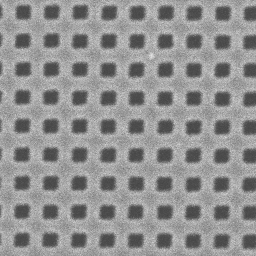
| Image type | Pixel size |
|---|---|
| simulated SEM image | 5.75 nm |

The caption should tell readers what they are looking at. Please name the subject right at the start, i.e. a regular array of holes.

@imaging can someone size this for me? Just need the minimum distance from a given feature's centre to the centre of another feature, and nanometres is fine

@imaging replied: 161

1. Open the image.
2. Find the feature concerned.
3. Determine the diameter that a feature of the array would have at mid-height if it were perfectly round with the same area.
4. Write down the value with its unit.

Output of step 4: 97.8 nanometres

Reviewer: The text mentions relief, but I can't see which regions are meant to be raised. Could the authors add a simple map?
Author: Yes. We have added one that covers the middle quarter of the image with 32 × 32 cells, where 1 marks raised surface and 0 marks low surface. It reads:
11000011100001110000111000001100
11000011100001110000111000011100
11000011100001110000111000011100
11111111111111111111111101111110
11111111111111111111111111111111
11111111111111111111111111111111
11100111111111111111111111111111
11000011100001110000111000011100
11000011100001110000111000011100
11000011100001110000111000011100
11110111111111111011111101111110
11111111111111111111111111111111
11111111111111111111111111111111
11111111111111111111111111111111
11000011100001110000111000011110
11000011100001110000111000011100
11000011100001110000111000011100
11111111111111111000111000011110
11111111111111111111111111111111
11111111111111111111111111111111
11111111111111111111111111111111
11000011100001110000111000011110
11000011100001110000111000011100
11000011100001110000111000011100
11000111100011110001111000111100
11111111111111111111111111111111
11111111111111111111111111111111
11111111111111111111111111111111
11000011100001110000111100011110
11000011100001110000111000011100
11000011100001110000111000011100
11000111100001110000111000011100